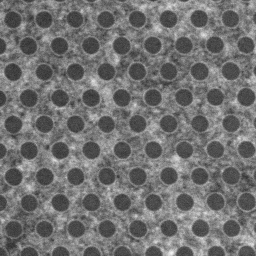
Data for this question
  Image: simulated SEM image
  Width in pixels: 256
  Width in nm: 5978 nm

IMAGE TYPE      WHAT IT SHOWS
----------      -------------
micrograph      a regular array of raised bodies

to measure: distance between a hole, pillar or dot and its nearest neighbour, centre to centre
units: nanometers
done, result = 706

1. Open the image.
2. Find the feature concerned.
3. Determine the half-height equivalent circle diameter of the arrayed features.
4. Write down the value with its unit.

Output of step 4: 448 nanometres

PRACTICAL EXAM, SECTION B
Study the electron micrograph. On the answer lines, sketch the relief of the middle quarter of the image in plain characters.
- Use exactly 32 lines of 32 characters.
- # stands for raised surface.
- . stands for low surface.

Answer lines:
.####....###....####....####....
.####...#####...#####...####....
.####...#####...#####...####....
.####....###.....###.....###....
................................
................................
.....###.....###.....###....###.
#....####...#####...####....####
#...#####...#####...####....####
#....####...#####...####....####
......##.....###.....##......##.
................................
................................
.####....###....####....####....
.####...#####...#####...####....
.####...#####...#####...####....
.####....###.....###....####....
................................
................................
.....###.....##......###.....##.
#....####....####...####....####
#...#####...#####...#####...####
#....####....####...#####...####
#.....##.....###.....###.....###
................................
................................
.####....###.....###....####....
.####...#####...#####...#####...
.####...#####...#####...#####...
.####....####....###....####....
................................
................................